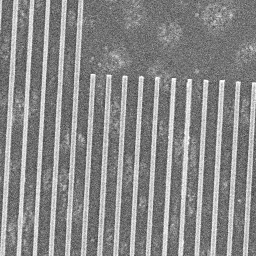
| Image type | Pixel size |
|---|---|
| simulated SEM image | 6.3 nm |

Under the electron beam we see parallel lines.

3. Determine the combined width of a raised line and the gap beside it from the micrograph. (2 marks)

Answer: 102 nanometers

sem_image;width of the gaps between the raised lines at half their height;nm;77.1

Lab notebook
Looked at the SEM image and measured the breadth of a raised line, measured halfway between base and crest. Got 29.1 nm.